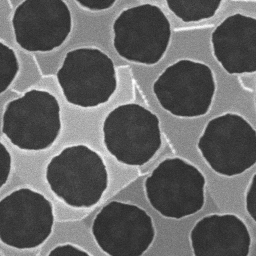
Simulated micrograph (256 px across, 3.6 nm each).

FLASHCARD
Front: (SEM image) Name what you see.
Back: holes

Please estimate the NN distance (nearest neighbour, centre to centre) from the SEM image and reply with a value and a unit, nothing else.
69.6 px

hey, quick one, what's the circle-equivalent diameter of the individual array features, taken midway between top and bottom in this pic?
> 212 nanometres